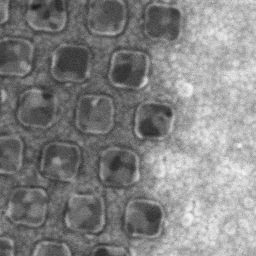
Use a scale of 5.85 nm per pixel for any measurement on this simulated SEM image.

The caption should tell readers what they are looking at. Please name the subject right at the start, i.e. a regular array of raised bodies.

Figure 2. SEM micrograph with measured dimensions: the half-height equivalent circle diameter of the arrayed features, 0.232 um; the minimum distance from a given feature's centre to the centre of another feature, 330 nanometers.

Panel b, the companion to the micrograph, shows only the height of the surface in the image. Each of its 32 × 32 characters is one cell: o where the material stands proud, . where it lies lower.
o...oooo...oooo....o............
o..ooooo...ooooo..ooooo.........
o...oooo...ooooo..ooooo.........
....oooo...oooo...ooooo.........
..................ooooo.........
oooo............................
oooo...oooo....o................
oooo...oooo...ooooo.............
oooo..ooooo...ooooo.............
.......oooo...oooo..............
..............oooo..............
...ooo..........................
...oooo...oooo..................
..ooooo...oooo...oooo...........
..ooooo...oooo...ooooo..........
...ooo....oooo...ooooo..........
............o....oooo...........
ooo.............................
ooo...oooo......................
ooo..ooooo...oooo...............
ooo..ooooo...oooo...............
oo...ooooo...oooo...............
.......oo....oooo...............
................................
.ooooo...oo.....................
.ooooo...oooo...oooo............
.ooooo..ooooo...oooo............
..ooo...ooooo...oooo............
.........oooo...oooo............
..................o.............
oo...ooo........................
oo..ooooo...oooo................